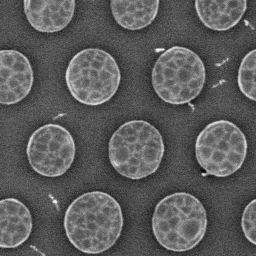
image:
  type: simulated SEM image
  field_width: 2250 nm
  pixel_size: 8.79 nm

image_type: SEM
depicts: raised bodies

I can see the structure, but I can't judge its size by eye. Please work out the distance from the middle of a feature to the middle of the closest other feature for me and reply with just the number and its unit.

738 nm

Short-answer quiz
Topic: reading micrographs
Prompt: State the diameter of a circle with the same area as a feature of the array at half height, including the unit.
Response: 54.2 pixels